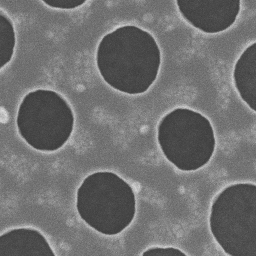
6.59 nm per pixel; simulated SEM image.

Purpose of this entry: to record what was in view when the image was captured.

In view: holes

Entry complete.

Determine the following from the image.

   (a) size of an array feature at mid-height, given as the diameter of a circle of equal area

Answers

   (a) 392 nm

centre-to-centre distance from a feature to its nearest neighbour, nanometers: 662